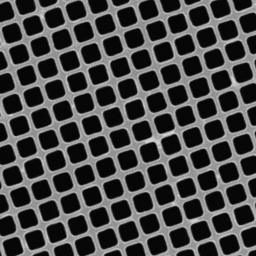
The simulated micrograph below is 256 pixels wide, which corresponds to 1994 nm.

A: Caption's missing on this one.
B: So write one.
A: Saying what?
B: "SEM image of a regular array of holes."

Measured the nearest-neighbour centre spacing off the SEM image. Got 174 nanometers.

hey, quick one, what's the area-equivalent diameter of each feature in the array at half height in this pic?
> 156 nm